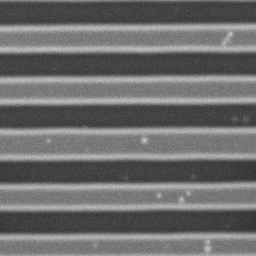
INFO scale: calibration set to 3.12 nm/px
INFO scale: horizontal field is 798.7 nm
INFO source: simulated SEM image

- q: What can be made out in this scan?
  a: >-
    groups of lines, slits or small figures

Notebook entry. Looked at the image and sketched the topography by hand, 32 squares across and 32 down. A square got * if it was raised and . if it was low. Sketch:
................................
................................
................................
********************************
********************************
********************************
................................
................................
................................
................................
********************************
********************************
********************************
................................
................................
................................
********************************
********************************
********************************
********************************
................................
................................
................................
********************************
********************************
********************************
................................
................................
................................
********************************
********************************
********************************